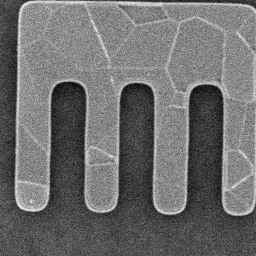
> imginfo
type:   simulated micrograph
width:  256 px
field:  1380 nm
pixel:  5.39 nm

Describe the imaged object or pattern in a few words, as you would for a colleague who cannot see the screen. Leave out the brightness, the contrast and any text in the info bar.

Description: groups of lines, slits or small figures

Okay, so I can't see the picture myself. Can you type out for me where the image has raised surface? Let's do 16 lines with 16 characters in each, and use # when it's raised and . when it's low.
.###############
.###############
.###############
.###############
.###############
.##..###.###..##
.##..##...##..##
.##..##...##..##
.##..##...##..##
.##..##...##..##
.##..##...##..##
.##..##...##..##
.##..##...##..##
................
................
................